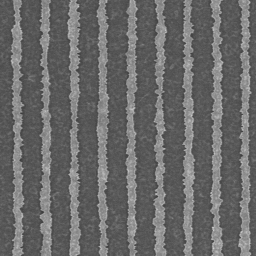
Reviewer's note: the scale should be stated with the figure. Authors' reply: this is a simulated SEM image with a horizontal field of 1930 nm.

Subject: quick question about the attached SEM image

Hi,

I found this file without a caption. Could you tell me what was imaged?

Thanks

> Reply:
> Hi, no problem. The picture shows parallel lines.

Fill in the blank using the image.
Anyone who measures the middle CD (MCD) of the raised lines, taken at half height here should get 52.8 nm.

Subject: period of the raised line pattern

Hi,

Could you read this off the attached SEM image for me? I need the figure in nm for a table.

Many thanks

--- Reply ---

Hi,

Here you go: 215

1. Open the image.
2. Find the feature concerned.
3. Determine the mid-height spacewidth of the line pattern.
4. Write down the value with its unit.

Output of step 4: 158 nm